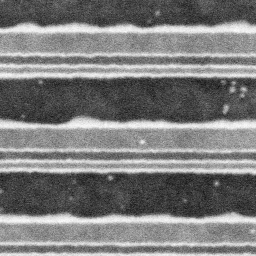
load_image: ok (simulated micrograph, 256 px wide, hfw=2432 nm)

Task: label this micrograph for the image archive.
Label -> lines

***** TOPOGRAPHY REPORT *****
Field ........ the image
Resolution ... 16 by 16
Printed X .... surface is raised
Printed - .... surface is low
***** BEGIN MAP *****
----------------
----------------
XXXXXXXXXXXXXXXX
XXXXXXXXXXXXXXXX
XXXXXXXXXXXXXXXX
----------------
----------------
----------------
XXXXXXXXXXXXXXXX
XXXXXXXXXXXXXXXX
XXXXXXXXXXXXXXXX
----------------
----------------
----------------
XXXXXXXXXXXXXXXX
XXXXXXXXXXXXXXXX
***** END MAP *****